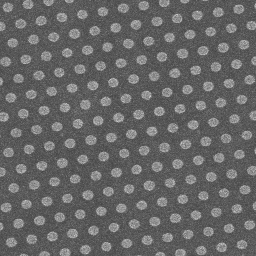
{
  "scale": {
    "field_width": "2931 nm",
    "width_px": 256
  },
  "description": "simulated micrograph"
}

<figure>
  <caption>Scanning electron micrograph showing a regular array of raised bodies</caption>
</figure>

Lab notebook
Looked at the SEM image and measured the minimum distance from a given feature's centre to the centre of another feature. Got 233 nm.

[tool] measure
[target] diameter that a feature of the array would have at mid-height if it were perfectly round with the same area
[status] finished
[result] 110 nanometers